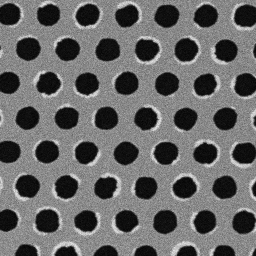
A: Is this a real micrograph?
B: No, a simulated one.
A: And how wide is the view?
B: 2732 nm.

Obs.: a regular array of holes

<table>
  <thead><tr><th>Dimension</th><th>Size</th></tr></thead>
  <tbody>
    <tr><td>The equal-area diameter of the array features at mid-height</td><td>248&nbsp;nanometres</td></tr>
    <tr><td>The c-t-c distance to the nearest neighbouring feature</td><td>416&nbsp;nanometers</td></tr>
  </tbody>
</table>